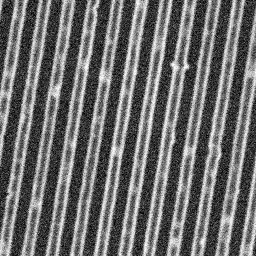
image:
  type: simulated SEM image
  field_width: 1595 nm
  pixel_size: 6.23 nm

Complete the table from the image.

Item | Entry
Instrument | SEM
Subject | parallel lines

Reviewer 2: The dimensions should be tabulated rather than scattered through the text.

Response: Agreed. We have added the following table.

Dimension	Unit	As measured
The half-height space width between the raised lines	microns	0.0852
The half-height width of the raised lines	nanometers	63.7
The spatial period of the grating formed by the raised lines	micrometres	0.149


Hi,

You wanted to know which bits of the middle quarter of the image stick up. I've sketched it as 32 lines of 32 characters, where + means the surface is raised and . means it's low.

...+++....++....++....++...++++.
...+++...+++...+++...+++....++..
...+++...+++...+++...+++...+++..
...++....++....+++...+++...+++..
...++....++....++....++....+++..
...++....++....++....++....++...
..+++....++....++....++....++...
..+++...+++...+++...+++....++...
..+++...+++...+++...+++...+++...
..++....++....+++...+++...+++...
..++....++....++....++....+++...
..++....++....++....++....++....
.+++....++....++....++....++....
.+++....++...+++....++....++....
.+++...+++...+++...+++...+++...+
.++....+++...+++...+++...+++...+
.++....++....++....++....++....+
.++....++....++....++....++....+
+++....++....++....++....+++...+
+++....++...+++....++....++....+
+++...+++...+++...+++...+++....+
++....+++...++....+++...+++...++
++....++....++....+++...+++...++
++....++....++....++....++....++
++....++....++....++....++....++
++...+++...+++....++....++....++
++...+++...+++...+++...+++....++
+....+++...+++...+++...+++...+++
+....++....++....+++...+++...+++
+....++....++....++....++....+++
+....++....++....++....++....++.
+...+++....++....++....++....++.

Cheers